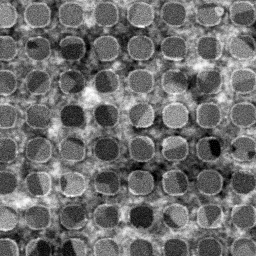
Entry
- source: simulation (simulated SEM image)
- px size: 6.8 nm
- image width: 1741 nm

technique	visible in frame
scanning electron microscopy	a regular array of raised bodies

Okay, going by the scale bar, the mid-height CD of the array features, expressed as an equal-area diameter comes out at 175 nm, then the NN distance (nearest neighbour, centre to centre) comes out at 0.228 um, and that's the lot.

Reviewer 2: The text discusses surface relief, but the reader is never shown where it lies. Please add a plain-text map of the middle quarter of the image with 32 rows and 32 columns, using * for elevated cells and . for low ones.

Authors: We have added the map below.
............**..................
..........................*.....
****....*****...******...*****..
*****...******..******...*****..
*****...******..******...******.
*****...******..******...******.
*****...*****....*****...*****..
................................
...*............................
....*...........................
****....*****....*****....****..
*****...******..******...******.
*****...******..******...******.
*****...******..******...******.
*****...*****...******...******.
****......***.....***.....****..
................................
................................
.***.....***......***.....***...
*****...*****....*****...******.
*****...******..******...******.
*****.*.******...*****...******.
*****.*.******...******..******.
*****.*.*****....*****...*****..
................................
................................
................................
****....*****....****....*****..
*****...******..******...******.
*****...******..******...******.
*****...******..******...******.
*****...******..******...******.